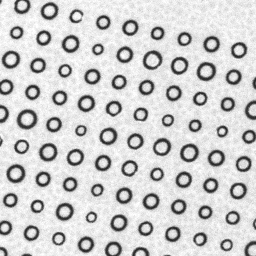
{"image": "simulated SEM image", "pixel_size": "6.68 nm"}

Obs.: a regular array of ring-shaped grooves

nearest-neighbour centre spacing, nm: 183